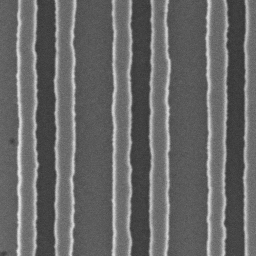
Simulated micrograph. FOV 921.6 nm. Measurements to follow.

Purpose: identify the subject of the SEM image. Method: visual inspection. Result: lines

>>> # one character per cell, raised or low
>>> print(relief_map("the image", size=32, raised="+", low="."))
..+++..++.....++...++.....++...+
..+++..++.....++...++.....++...+
..++...++.....++...++.....++...+
..++...++.....++...++.....++...+
..++...++.....++...++.....++...+
..++...++.....++...++.....++...+
..++...++.....++...++.....++...+
..++...++.....++...++.....++...+
..++...++.....++...++.....++...+
..+++..++.....++...++.....++...+
..+++..++.....++...++.....++...+
..+++..++.....++...++.....++...+
..+++..++.....++...++.....++...+
..+++..++.....++...++.....++...+
..++...++.....++...++.....++...+
..++...++.....++...++.....++...+
..++...++.....++...++.....++...+
..++...++.....++...++.....++...+
..++...++.....++...++.....++...+
..+++..++.....++...++.....++...+
..+++..++.....++...++.....++...+
..+++..++.....++...++.....++...+
..+++..++.....++...++.....++..++
..++...++.....++...++.....++...+
..+++..++.....++...++.....++...+
..++...++.....++...++.....++...+
..++...++.....++...++.....++...+
..+++..++.....++...++.....++...+
..++...++.....++...++.....++...+
..++...++.....++...++.....++...+
..++...++.....++...++.....++...+
..++...++.....++...++.....++...+